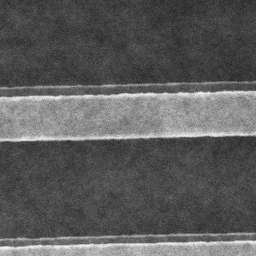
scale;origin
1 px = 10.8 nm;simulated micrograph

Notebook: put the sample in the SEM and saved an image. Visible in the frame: lines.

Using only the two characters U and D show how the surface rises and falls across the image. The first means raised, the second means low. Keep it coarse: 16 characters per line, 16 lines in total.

DDDDDDDDDDDDDDDD
DDDDDDDDDDDDDDDD
DDDDDDDDDDDDDDDD
DDDDDDDDDDDDDDDD
DDDDDDDDDDDDDDDD
DUUUUUUUUUUUUUUU
UUUUUUUUUUUUUUUU
UUUUUUUUUUUUUUUU
UUUUUUUUUUUUUUDD
DDDDDDDDDDDDDDDD
DDDDDDDDDDDDDDDD
DDDDDDDDDDDDDDDD
DDDDDDDDDDDDDDDD
DDDDDDDDDDDDDDDD
DDDDDDDDDDDDDDDD
UUUUUUUUUUUUUUUU